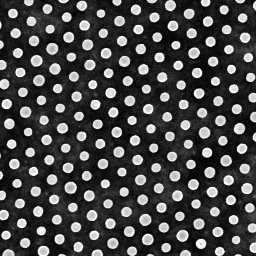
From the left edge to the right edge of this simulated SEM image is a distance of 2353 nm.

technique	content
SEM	a regular array of raised bodies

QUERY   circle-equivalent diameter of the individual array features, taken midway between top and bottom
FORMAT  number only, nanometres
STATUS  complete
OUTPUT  86.7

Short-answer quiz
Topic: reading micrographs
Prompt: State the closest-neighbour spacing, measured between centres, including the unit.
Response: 181 nm